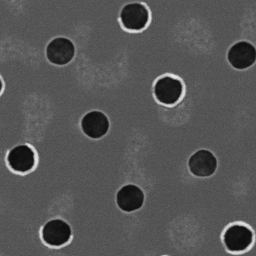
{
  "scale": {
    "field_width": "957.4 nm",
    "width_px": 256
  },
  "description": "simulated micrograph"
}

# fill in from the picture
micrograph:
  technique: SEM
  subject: a regular array of holes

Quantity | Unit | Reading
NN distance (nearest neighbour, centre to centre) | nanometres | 303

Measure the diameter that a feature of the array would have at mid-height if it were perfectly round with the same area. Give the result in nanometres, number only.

101